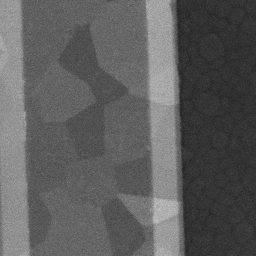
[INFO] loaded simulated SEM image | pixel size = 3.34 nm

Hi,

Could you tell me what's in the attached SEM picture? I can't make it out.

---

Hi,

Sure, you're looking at one or a few lines or trenches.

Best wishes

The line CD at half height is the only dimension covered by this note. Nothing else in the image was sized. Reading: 504 nanometers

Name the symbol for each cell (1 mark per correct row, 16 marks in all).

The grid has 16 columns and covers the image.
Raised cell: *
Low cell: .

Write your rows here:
**********......
**********......
.*********......
.*********......
.*********......
.*********......
.*********......
.*********......
.*********......
.*********......
.*********......
.*********......
.*********......
.*********......
.*********......
.*********......